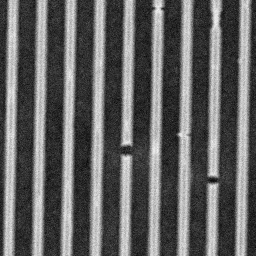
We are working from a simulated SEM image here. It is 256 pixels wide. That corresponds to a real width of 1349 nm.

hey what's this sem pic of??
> parallel lines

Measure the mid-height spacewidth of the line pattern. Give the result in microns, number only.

0.109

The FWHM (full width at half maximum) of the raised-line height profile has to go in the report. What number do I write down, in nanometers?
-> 45.5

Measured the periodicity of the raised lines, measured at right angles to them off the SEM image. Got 153 nanometres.